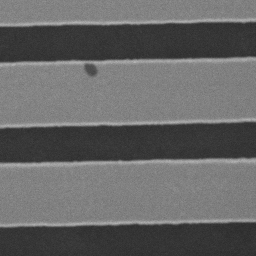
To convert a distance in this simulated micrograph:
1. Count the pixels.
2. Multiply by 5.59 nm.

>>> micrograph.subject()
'lines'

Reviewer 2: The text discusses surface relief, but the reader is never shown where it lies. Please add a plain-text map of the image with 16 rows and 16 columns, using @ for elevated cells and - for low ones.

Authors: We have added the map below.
@@@@@@@@@@@@@@@@
@@@@@@@@--------
----------------
----------------
@@@@@@@@@@@@@@@@
@@@@@@@@@@@@@@@@
@@@@@@@@@@@@@@@@
@@@@@@@@@@@@@@@@
----------------
----------------
@@@@@@@@@@@@@@@@
@@@@@@@@@@@@@@@@
@@@@@@@@@@@@@@@@
@@@@@@@@@@@@@@@@
----------------
----------------